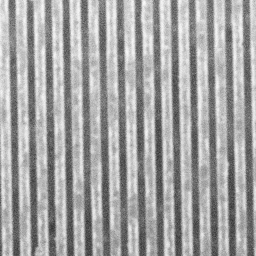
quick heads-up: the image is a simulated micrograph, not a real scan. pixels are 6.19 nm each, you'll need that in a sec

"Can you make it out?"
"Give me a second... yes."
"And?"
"parallel lines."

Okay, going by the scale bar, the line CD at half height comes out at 58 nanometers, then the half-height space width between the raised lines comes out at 53.4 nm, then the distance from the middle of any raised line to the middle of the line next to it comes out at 18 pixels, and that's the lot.